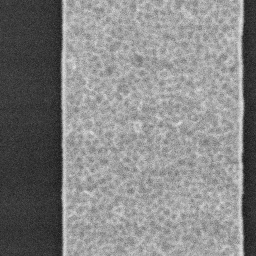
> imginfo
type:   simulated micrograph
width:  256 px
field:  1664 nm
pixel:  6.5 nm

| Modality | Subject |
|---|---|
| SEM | one or a few lines or trenches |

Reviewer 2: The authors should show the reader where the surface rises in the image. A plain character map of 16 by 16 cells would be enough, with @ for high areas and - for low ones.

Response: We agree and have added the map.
----@@@@@@@@@@@-
----@@@@@@@@@@@-
----@@@@@@@@@@@-
----@@@@@@@@@@@-
----@@@@@@@@@@@-
----@@@@@@@@@@@-
----@@@@@@@@@@@-
----@@@@@@@@@@@-
----@@@@@@@@@@@-
----@@@@@@@@@@@-
----@@@@@@@@@@@-
----@@@@@@@@@@@-
----@@@@@@@@@@@-
----@@@@@@@@@@@-
----@@@@@@@@@@@-
----@@@@@@@@@@@-